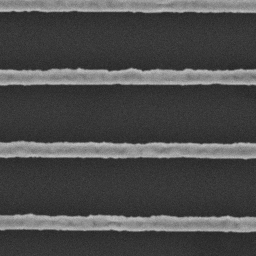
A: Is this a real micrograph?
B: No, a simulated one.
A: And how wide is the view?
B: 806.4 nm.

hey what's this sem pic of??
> lines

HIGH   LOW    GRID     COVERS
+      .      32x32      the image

++++++++++++++++++++++++++++++++
..................+...+.++++.+++
................................
................................
................................
................................
................................
................................
................................
++++++++++++++++++++++++++++++++
++++++++++++++.++++++++++++.++++
................................
................................
................................
................................
................................
................................
................................
++++++++++++++++++++++++++++++++
++++++++++++++++++++++++++++++++
................................
................................
................................
................................
................................
................................
................................
++++++++++++++++++++++++++++++++
++++++++++++++++++++++++++++++++
................................
................................
................................